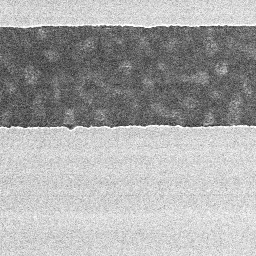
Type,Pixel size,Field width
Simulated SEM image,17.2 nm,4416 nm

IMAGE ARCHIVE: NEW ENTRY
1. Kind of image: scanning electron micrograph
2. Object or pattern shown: one or a few lines or trenches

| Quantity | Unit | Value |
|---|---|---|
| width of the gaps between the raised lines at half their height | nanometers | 1750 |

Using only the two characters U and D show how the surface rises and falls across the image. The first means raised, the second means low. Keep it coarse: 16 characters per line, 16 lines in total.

UUUUUUUUUUUUUUUU
UUUUUUUUUUUUUUUU
DDDDDDDDDDDDDDDD
DDDDDDDDDDDDDDDD
DDDDDDDDDDDDDDDD
DDDDDDDDDDDDDDDD
DDDDDDDDDDDDDDDD
DDDDDDDDDDDDDDDD
UUUUUUUUUUUUUUUU
UUUUUUUUUUUUUUUU
UUUUUUUUUUUUUUUU
UUUUUUUUUUUUUUUU
UUUUUUUUUUUUUUUU
UUUUUUUUUUUUUUUU
UUUUUUUUUUUUUUUU
UUUUUUUUUUUUUUUU